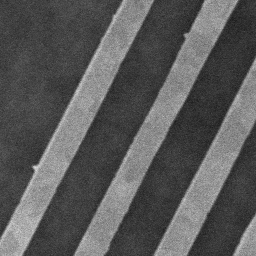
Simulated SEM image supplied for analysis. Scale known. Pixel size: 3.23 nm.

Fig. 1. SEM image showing one or a few lines or trenches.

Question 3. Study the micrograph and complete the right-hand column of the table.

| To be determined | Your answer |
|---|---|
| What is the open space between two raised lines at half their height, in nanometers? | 148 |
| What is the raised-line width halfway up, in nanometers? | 86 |